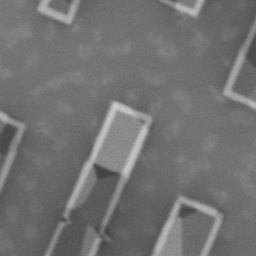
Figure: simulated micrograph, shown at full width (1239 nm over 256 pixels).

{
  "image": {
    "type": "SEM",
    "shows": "one or a few lines or trenches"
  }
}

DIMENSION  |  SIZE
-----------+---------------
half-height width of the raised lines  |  184 nanometers